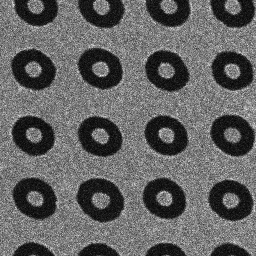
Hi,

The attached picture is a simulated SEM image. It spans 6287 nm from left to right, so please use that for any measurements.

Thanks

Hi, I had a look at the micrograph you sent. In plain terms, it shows a regular array of ring-shaped grooves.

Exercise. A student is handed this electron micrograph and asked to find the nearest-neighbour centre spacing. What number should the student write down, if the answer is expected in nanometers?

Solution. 1560